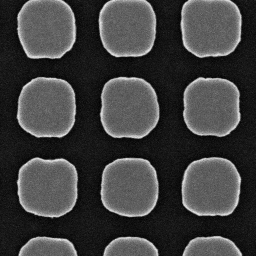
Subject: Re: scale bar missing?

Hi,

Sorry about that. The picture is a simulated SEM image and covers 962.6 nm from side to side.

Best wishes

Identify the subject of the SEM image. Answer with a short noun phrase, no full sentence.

raised bodies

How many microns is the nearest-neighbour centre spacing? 0.299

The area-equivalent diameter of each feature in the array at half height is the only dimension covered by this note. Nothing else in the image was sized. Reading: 229 nm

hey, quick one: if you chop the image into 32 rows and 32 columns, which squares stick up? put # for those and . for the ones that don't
...#####.....######....######...
..#######....######....#######..
..#######....######....#######..
..#######....######....#######..
..#######....######....#######..
...######....######....#######..
...#####......####......#####...
................................
................................
................................
...######....######.....#####...
...######....######....#######..
..#######....#######...#######..
..#######....#######...#######..
..#######....#######...#######..
..#######....#######...#######..
....#####....######.....#####...
................................
................................
................................
...######.....#####.....#####...
..########...######....#######..
..########...#######...#######..
..########...#######...#######..
..########...#######...#######..
...######....######....#######..
....#####.....#####.....#####...
................................
................................
................................
...######.....#####.....#####...
..#######....#######...#######..